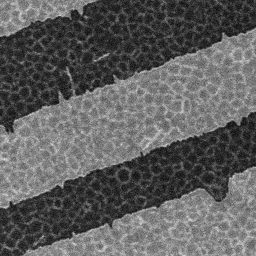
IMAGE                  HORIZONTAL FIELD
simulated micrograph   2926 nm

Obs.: one or a few lines or trenches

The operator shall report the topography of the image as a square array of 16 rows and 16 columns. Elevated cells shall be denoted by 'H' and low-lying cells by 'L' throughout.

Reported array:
HHHHHLLLLLLLLLLL
HHLLLLLLLLLLLLLL
LLLLLLLLLLLLLLHH
LLLLLLLLLLLHHHHH
LLLLLLLLLHHHHHHH
LLLLLLHHHHHHHHHH
LLLHHHHHHHHHHHHH
LHHHHHHHHHHHHHHL
HHHHHHHHHHHHLLLL
HHHHHHHHHLLLLLLL
HHHHHHLLLLLLLLLL
HHHHLLLLLLLLLLHH
HLLLLLLLLLLHHHHH
LLLLLLLLHHHHHHHH
LLLLLHHHHHHHHHHH
LLLHHHHHHHHHHHHH